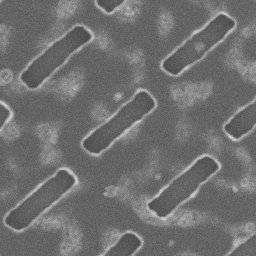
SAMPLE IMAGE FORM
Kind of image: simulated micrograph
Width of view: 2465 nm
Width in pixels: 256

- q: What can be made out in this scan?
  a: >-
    holes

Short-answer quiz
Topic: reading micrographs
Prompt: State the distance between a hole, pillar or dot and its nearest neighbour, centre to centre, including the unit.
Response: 892 nm